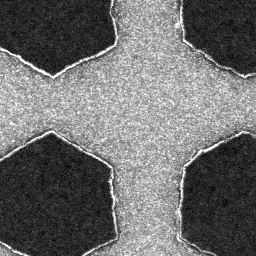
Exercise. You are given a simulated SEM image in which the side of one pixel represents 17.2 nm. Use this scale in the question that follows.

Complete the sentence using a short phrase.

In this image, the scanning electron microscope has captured raised bodies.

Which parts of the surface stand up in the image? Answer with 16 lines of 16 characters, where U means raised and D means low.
UUUUUUUDDDDUUUUU
UUUUUUUDDDDUUUUU
UUUUUUUDDDDDUUUU
DUUUUUDDDDDDDUUU
DDDUDDDDDDDDDDDU
DDDDDDDDDDDDDDDD
DDDDDDDDDDDDDDDD
DDDDDDDDDDDDDDDD
DDDUDDDDDDDDDDDU
DUUUUDDDDDDDDUUU
UUUUUUUDDDDDUUUU
UUUUUUUDDDDUUUUU
UUUUUUUDDDDUUUUU
UUUUUUUDDDDUUUUU
UUUUUUUDDDDUUUUU
DUUUUUDDDDDDUUUU